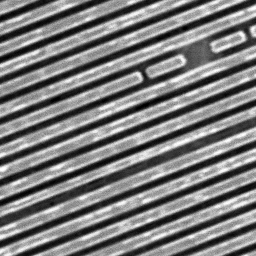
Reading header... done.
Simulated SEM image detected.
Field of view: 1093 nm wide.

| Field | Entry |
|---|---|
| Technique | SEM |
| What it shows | parallel lines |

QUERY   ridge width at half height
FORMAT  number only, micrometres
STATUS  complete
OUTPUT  0.0472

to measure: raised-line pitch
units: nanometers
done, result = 81.3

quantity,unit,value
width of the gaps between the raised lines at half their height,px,7.56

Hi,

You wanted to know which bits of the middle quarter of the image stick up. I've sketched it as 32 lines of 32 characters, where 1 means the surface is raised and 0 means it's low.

11110000011111110000001111111100
10000001111111000000011111100000
00001111111000000110011110000011
01111111100000111111000000011111
11111100000011111110000001111111
11110000011111111000001111111100
10000001111111000000111111100000
00001111111100000111111110000001
01111111100000011111110000001111
11111110000011111111000001111111
11110000001111111000000111111100
11000001111111000000111111110000
00000111111100000011111110000011
00111111100000011111111000001111
11111110000001111111000001111111
11110000001111111100000111111100
11000000111111100000111111110000
00000111111100000011111110000011
00011111110000011111111000001111
11111110000001111111100001111110
11111000001111111100000111111000
11000000111111110000111111000000
00000111111100000011111000000001
00011111110000011111100000001111
11111110000001111100000000111111
11111000001111110000000111111110
11000000111110000000011111111000
00000111111000000011111111000000
00011111000000001111111000000111
11111100000001111111100000011111
11100000000111111100000011111110
10000000111111110000011111111000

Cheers